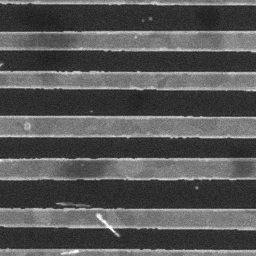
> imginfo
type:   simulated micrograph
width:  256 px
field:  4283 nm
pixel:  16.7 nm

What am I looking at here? lines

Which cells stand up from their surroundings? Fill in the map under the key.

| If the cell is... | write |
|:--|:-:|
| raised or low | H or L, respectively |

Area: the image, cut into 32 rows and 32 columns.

LLLLLLLLLLLLLLLLLLLLHHHHHHHHHHHH
LLLLLLLLLLLLLLLLLLLLLLLLLLLLLLLL
LLLLLLLLLLLLLLLLLLLLLLLLLLLLLLLL
LLLLLLLLLLLLLLLLLLLLLLLLLLLLLLLL
HHHHHHHHHHHHHHHHHHHHHHHHHHHHHHHH
HHHHHHHHHHHHHHHHHHHHHHHHHHHHHHHH
LLLLLLLLLLLLLLLLLLLLLLLLLLLLLLLL
LLLLLLLLLLLLLLLLLLLLLLLLLLLLLLLL
LLLLLLLLLLLLLLLLLLLLLLLLLLLLLLLL
HHHHHHHHHHHHHHHHHHHHHHHHHHHHHHHH
HHHHHHHHHHHHHHHHHHHHHHHHHHHHHHHH
LLLLLLLLLLLLLLLLLLLLLLLLLLLLLLLL
LLLLLLLLLLLLLLLLLLLLLLLLLLLLLLLL
LLLLLLLLLLLLLLLLLLLLLLLLLLLLLLLL
LLLLLLLLLLLLLLLLLLLLLLLLLLLLLLLL
HHHHHHHHHHHHHHHHHHHHHHHHHHHHHHHH
HHHHHHHHHHHHHHHHHHHHHHHHHHHHHHHH
LLLLLLLLLLLLLLLLLLLLLLLLLLLLLLLL
LLLLLLLLLLLLLLLLLLLLLLLLLLLLLLLL
LLLLLLLLLLLLLLLLLLLLLLLLLLLLLLLL
HHHHHHHHHHHHHHHHHHHHHHHHHHHHHHHH
HHHHHHHHHHHHHHHHHHHHHHHHHHHHHHHH
LLLLLLLLLLLLLLLLLLLLLLLLLLLLLLLL
LLLLLLLLLLLLLLLLLLLLLLLLLLLLLLLL
LLLLLLLLLLLLLLLLLLLLLLLLLLLLLLLL
LLLLLLLLLLLLLLLLLLLLLLLLLLLLLLLL
HHHHHHHHHHHHHHHHHHHHHHHHHHHHHHHH
HHHHHHHHHHHHHHHHHHHHHHHHHHHHHHHH
LLLLLLLLLLLLLHHLLLLLHHHHHHHHHHHH
LLLLLLLLLLLLLLLLLLLLLLLLLLLLLLLL
LLLLLLLLLLLLLLLLLLLLLLLLLLLLLLLL
HHHHHHHHHHHHHHHHHHHHHHHHHHHHHHHH